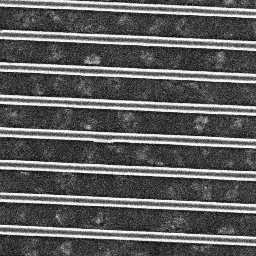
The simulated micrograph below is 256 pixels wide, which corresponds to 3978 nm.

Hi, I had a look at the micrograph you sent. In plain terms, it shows parallel lines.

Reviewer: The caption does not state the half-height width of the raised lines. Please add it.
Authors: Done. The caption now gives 0.118 micrometres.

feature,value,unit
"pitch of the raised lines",505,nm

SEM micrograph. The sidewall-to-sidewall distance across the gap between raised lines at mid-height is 0.388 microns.